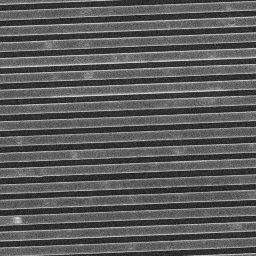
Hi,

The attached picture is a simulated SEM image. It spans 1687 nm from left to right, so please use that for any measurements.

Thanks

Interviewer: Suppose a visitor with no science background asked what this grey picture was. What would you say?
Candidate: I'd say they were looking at parallel lines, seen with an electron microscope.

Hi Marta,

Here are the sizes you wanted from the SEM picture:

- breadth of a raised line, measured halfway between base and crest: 61.7 nanometres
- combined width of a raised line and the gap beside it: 0.104 microns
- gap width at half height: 0.0444 micrometres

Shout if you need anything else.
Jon